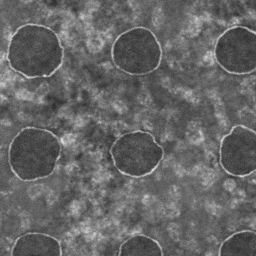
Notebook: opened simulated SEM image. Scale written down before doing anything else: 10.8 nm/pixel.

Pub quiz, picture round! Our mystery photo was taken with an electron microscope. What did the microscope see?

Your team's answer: raised bodies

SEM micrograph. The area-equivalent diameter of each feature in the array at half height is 549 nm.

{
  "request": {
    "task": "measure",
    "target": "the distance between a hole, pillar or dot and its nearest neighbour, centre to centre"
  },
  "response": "1100 nanometers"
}